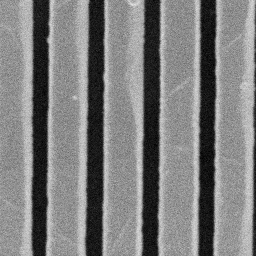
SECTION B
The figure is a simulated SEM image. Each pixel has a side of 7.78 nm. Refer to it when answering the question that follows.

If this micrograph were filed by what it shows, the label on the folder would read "lines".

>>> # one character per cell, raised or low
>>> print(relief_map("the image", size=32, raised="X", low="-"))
XXXX--XXXXX--XXXXX--XXXXX--XXXXX
XXXX--XXXXX--XXXX---XXXXX--XXXXX
XXXX--XXXXX--XXXX---XXXXX--XXXX-
XXXX--XXXXX--XXXX---XXXXX--XXXX-
XXXX--XXXXX--XXXX---XXXXX--XXXX-
XXXX--XXXXX--XXXX---XXXXX--XXXX-
XXXX--XXXXX--XXXX---XXXXX--XXXX-
XXXX--XXXXX--XXXX---XXXXX--XXXX-
XXXX--XXXXX--XXXX---XXXXX--XXXX-
XXXX--XXXXX--XXXX---XXXXX--XXXX-
XXXX--XXXXX--XXXX---XXXXX--XXXX-
XXXX--XXXXX--XXXX---XXXXX--XXXX-
XXXX--XXXXX--XXXX---XXXXX--XXXX-
XXXX--XXXXX--XXXXX--XXXXX--XXXX-
XXXX--XXXXX--XXXXX--XXXXX--XXXX-
XXXX--XXXXX--XXXXX--XXXXX--XXXX-
XXXX--XXXXX--XXXXX--XXXXX--XXXX-
XXXX--XXXX---XXXXX--XXXXX--XXXX-
XXXX--XXXXX--XXXXX--XXXXX--XXXX-
XXXX--XXXXX--XXXXX--XXXXX--XXXX-
XXXX--XXXXX--XXXXX--XXXXX--XXXX-
XXXX--XXXX---XXXXX--XXXXX--XXXX-
XXXX--XXXX---XXXXX--XXXXX--XXXX-
XXXX--XXXX---XXXXX--XXXXX--XXXX-
XXXX--XXXX---XXXXX--XXXXX--XXXX-
XXXX--XXXX---XXXXX--XXXXX--XXXX-
XXXX--XXXX---XXXXX--XXXXX--XXXX-
XXXX--XXXX---XXXXX--XXXXX--XXXX-
XXXX--XXXX---XXXXX--XXXXX--XXXX-
XXXX--XXXX---XXXXX--XXXXX--XXXX-
XXXX--XXXX---XXXXX--XXXXX--XXXX-
XXXX--XXXX---XXXXX--XXXXX--XXXX-